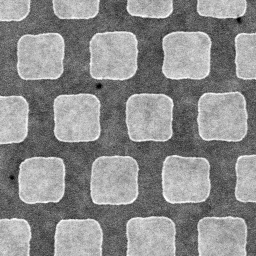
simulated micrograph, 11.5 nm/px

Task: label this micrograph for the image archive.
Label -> a regular array of raised bodies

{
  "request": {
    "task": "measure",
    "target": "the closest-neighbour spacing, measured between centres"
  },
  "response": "0.822 micrometres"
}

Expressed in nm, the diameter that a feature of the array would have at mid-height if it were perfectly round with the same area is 584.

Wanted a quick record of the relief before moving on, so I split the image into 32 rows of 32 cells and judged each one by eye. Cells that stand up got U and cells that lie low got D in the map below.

UUUUDDDUUUUUDDDDUUUUUDDDDUUUUUUD
UUUUDDDUUUUUDDDDUUUUUDDDDUUUUUUD
UUDDDDDDDDDDDDDDDDDDDDDDDDDDDDDD
DDDDDDDDDDDDDDDDDDDDDDDDDDDDDDDD
DDDUUUUDDDDDUUUUUDDDDUUUUUDDDDUU
DDUUUUUUDDDUUUUUUDDDUUUUUUDDDUUU
DDUUUUUUDDDUUUUUUDDDDUUUUUDDDDUU
DDUUUUUUDDDUUUUUUDDDDUUUUUDDDUUU
DDUUUUUUDDDUUUUUUDDDUUUUUUDDDDUU
DDDUUUUDDDDDUUUUDDDDDUUUUUDDDDUU
DDDDDDDDDDDDDDDDDDDDDDDDDDDDDDDD
DDDDDDDDDDDDDDDDDDDDDDDDDDDDDDDD
UUUDDDDUUUUUDDDDUUUUUDDDDUUUUUUD
UUUDDDDUUUUUDDDDUUUUUUDDDUUUUUUD
UUUDDDDUUUUUDDDDUUUUUDDDDUUUUUUD
UUUDDDDUUUUUDDDDUUUUUDDDDUUUUUUD
UUUDDDDUUUUUDDDDUUUUUDDDDUUUUUUD
UUUDDDDDUUUUDDDDDUUUUDDDDDDDUUDD
DDDDDDDDDDDDDDDDDDDDDDDDDDDDDDDD
DDDDDDDDDDDDDDDDDDDDDDDDDDDDDDDU
DDDUUUUUDDDDUUUUUDDDDUUUUUDDDDUU
DDUUUUUUDDDDUUUUUDDDUUUUUUDDDDUU
DDUUUUUUDDDUUUUUUDDDUUUUUUDDDDUU
DDUUUUUUDDDUUUUUUDDDUUUUUUDDDUUU
DDUUUUUUDDDUUUUUUDDDDUUUUUDDDUUU
DDDDDDDDDDDDDDUDDDDDDDDDDDDDDDDD
DDDDDDDDDDDDDDDDDDDDDDDDDDDDDDDD
UUUDDDDDDUUUDDDDUUUUUDDDDUUUUUDD
UUUUDDDUUUUUUDDDUUUUUUDDDUUUUUUD
UUUUDDDUUUUUUDDDUUUUUUDDDUUUUUUD
UUUUDDDUUUUUUDDDUUUUUUDDDUUUUUUD
UUUUDDDUUUUUUDDDUUUUUUDDDUUUUUUD